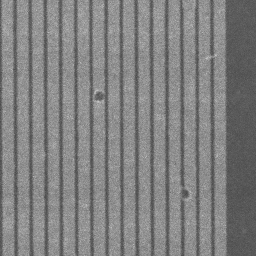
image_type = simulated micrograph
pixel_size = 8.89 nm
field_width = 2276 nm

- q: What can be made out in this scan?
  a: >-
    parallel lines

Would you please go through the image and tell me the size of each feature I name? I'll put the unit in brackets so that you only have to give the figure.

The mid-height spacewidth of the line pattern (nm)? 36.7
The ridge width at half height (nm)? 97.8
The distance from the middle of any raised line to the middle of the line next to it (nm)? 135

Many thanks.